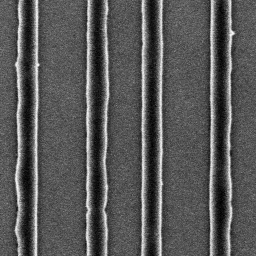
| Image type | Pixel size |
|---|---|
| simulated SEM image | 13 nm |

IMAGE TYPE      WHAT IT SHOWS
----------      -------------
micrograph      one or a few lines or trenches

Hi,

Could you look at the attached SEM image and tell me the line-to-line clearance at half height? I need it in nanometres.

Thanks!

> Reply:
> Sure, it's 643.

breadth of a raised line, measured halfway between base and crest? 250 nm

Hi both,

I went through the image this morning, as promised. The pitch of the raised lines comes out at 839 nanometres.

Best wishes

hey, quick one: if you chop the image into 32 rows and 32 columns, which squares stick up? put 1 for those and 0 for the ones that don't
00111000000110000011000000111000
00111000000110000011000000111000
00111000000110000011000000111000
00111000000110000011000000111000
00111000000110000011000000111000
00111000000110000011000000111000
00111000000110000011000000111000
00111000000110000011000000111000
00111000000110000011000000111000
00111000000110000011000000111000
00111000000111000011000000111000
00111000000111000011000000111000
00111000000110000011000000111000
00111000000110000011000000111000
00111000000110000011000000111000
00111000000110000011000000111000
00111000000110000011000000111000
00110000000110000011000000111000
00110000000110000011000000111000
00110000000110000011000000111000
00111000000110000011000000111000
00111000000110000011000000111000
00111000000110000011000000111000
00111000000110000011000000111000
00111000000110000011000000111000
00111000000110000011000000111000
00110000000110000011000000111000
00110000000110000011000000111000
00110000000110000011000000111000
00111000000110000011000000111000
00111000000110000011000000111000
00111000000110000011000000111000